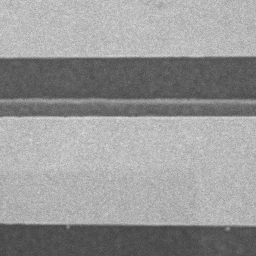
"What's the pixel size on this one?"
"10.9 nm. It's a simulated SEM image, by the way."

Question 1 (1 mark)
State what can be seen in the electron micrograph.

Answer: lines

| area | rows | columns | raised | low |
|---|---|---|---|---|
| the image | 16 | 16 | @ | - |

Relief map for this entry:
@@@@@@@@@@@@@@@@
@@@@@@@@@@@@@@@@
@@@@@@@@@@@@@@@@
@@@@@@@@@@@@@@--
----------------
----------------
@@@--@@@-----@@-
@@@@@@@@@@@@@@@@
@@@@@@@@@@@@@@@@
@@@@@@@@@@@@@@@@
@@@@@@@@@@@@@@@@
@@@@@@@@@@@@@@@@
@@@@@@@@@@@@@@@@
@@@@@@@@@@@@@@@@
----------------
----------------